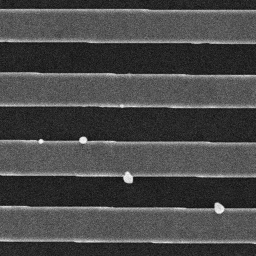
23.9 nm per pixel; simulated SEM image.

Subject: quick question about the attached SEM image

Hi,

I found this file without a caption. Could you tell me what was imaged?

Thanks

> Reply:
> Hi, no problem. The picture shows lines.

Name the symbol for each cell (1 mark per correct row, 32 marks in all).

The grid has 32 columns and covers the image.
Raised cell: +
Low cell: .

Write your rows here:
................................
++++++++++++++++++++++++++++++++
++++++++++++++++++++++++++++++++
++++++++++++++++++++++++++++++++
++++++++++++++++++++++++++++++++
................................
................................
................................
................................
++++++++++++++++++++++++++++++++
++++++++++++++++++++++++++++++++
++++++++++++++++++++++++++++++++
++++++++++++++++++++++++++++++++
................................
................................
................................
................................
..........+.....................
++++++++++++++++++++++++++++++++
++++++++++++++++++++++++++++++++
++++++++++++++++++++++++++++++++
++++++++++++++++++++++++++++++++
................+...............
................................
................................
................................
++++++++++++++++++++++++++++++++
++++++++++++++++++++++++++++++++
++++++++++++++++++++++++++++++++
++++++++++++++++++++++++++++++++
................................
................................